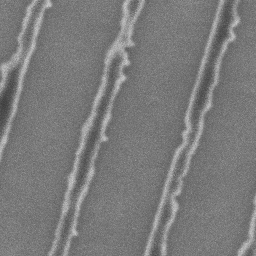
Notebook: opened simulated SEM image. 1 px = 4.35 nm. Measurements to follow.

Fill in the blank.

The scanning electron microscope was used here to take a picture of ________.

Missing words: one or a few lines or trenches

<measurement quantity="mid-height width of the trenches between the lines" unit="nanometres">330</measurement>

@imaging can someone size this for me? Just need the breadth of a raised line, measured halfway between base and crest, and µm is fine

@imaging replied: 0.0698